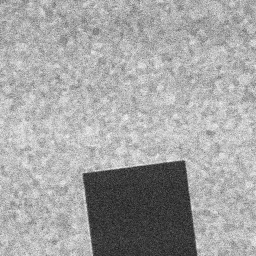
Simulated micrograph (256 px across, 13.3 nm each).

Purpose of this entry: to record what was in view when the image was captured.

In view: one or a few lines or trenches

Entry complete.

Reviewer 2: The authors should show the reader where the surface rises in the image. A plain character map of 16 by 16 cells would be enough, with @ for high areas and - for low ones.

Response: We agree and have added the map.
@@@@@@@@@@@@@@@@
@@@@@@@@@@@@@@@@
@@@@@@@@@@@@@@@@
@@@@@@@@@@@@@@@@
@@@@@@@@@@@@@@@@
@@@@@@@@@@@@@@@@
@@@@@@@@@@@@@@@@
@@@@@@@@@@@@@@@@
@@@@@@@@@@@@@@@@
@@@@@@@@@@@@@@@@
@@@@@@@-----@@@@
@@@@@-------@@@@
@@@@@-------@@@@
@@@@@-------@@@@
@@@@@@------@@@@
@@@@@@------@@@@